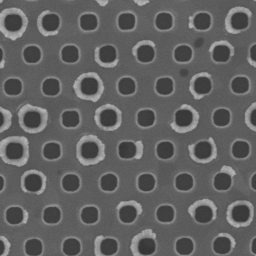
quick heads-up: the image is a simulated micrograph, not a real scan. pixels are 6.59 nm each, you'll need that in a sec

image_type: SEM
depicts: a regular array of holes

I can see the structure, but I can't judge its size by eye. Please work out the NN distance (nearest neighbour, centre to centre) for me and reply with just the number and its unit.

0.243 microns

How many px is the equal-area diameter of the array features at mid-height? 18.6